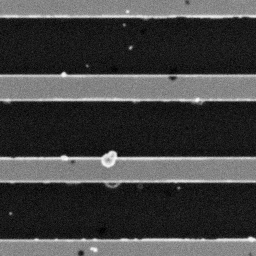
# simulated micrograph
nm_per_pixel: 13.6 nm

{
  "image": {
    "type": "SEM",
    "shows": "lines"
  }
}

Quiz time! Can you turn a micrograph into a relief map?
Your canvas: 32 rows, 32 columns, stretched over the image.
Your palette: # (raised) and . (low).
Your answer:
################################
################################
................................
................................
................................
................................
................................
................................
................................
################################
################################
################################
################################
................................
................................
................................
................................
................................
................................
.............##.................
################################
################################
################################
................................
................................
................................
................................
................................
................................
................................
################################
################################